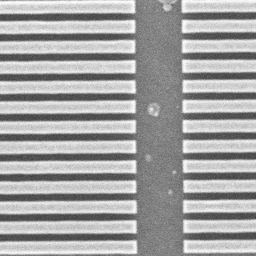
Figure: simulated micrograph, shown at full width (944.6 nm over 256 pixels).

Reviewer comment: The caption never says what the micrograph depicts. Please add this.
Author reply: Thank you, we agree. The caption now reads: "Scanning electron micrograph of groups of lines, slits or small figures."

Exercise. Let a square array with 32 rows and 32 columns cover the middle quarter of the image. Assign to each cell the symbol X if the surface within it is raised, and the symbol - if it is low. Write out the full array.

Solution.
XXXXXXXXXXXXXXXXXX------------XX
XXXXXXXXXXXXXXXXXX------------XX
--------------------------------
--------------------------------
XXXXXXXXXXXXXXXXXX------------XX
XXXXXXXXXXXXXXXXXX------------XX
XXXXXXXXXXXXXXXXXX------------XX
--------------------------------
--------------------------------
---XXXXXXXXXXXXXXX------------XX
XXXXXXXXXXXXXXXXXX------------XX
XXXXXXXXXXXXXXXXXX------------XX
--------------------------------
--------------------------------
XXXXXXXXXXXXXXXXXX------------XX
XXXXXXXXXXXXXXXXXX------------XX
XXXXXXXXXXXXXXXXXX------------XX
--------------------------------
--------------------------------
XXXXXXXXXXXXXXXXXX------------XX
XXXXXXXXXXXXXXXXXX------------XX
XXXXXXXXXXXXXXXXXX------------XX
--------------------------------
--------------------------------
XXXXXXXXXXXXXXXXXX------------XX
XXXXXXXXXXXXXXXXXX------------XX
XXXXXXXXXXXXXXXXXX------------XX
--------------------------------
--------------------------------
XXXXXXXXXXXXXXXXXX------------XX
XXXXXXXXXXXXXXXXXX------------XX
XXXXXXXXXXXXXXXXXX------------XX